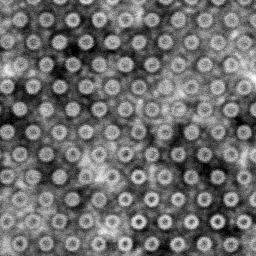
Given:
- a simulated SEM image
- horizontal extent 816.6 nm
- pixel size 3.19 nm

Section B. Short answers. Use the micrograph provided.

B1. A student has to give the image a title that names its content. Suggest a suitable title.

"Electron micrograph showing a regular array of raised bodies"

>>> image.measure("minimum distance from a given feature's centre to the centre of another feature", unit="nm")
82.2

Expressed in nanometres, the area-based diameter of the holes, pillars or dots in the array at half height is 42.4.